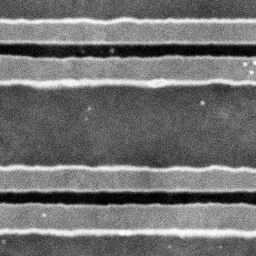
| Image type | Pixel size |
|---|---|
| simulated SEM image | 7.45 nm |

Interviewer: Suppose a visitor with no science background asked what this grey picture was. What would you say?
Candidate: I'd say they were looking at lines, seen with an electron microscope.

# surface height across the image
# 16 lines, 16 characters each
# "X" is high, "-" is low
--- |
----------------
XXXXXXXXXXXXXXXX
XXXXXXXXXXXXXXXX
XXXXXXXXXXXXXXXX
XXXXXXXXXXXXXXXX
----------------
----------------
----------------
----------------
----------------
-X-XXX-------X--
XXXXXXXXXXXXXXXX
XXXXXXXXXXXXXXXX
XXXXXXXXXXXXXXXX
----X--XX----X-X
----------------